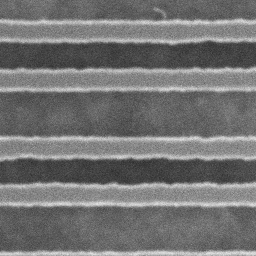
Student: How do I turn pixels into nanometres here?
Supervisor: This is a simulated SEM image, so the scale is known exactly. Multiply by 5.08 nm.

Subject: lines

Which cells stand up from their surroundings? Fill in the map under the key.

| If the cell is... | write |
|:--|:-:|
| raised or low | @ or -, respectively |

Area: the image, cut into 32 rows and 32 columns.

--------------------------------
--------------------------------
--------------------------------
@@@@@@@@@@@@@@@@@@@@@@@@@@@@@@@@
@@@@@@@@@@@@@@@@@@@@@@@@@@@@@@@@
--------------------------------
--------------------------------
--------------------------------
--------------------------------
@@@@@@@@@@@@@@@@@@@@@@@@@@@@@@@@
@@@@@@@@@@@@@@@@@@@@@@@@@@@@@@@@
--------------------------------
--------------------------------
--------------------------------
--------------------------------
--------------------------------
--------------------------------
@@@@@@@@@@@@@@@@@@@@@@@@@@@@@@@@
@@@@@@@@@@@@@@@@@@@@@@@@@@@@@@@@
@@@@@@@@@@@@@@@@@@@@@@@@@@@@@@@@
--------------------------------
--------------------------------
--------------------------------
@@@@@@@@@@@@@@@@@@@@@@@@@@@@@@@@
@@@@@@@@@@@@@@@@@@@@@@@@@@@@@@@@
@@@@@@@@@@@@@@@@@@@@@@@@@@@@@@@@
--------------------------------
--------------------------------
--------------------------------
--------------------------------
--------------------------------
--------------------@--------@@-